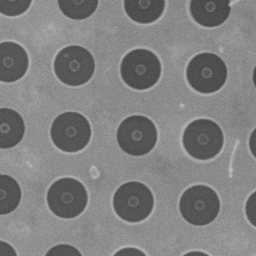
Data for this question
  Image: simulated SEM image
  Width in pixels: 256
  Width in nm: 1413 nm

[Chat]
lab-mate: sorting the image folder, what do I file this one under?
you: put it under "an array of small figures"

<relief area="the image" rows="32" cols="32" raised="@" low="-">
----@@@-----@@@---@--@@---@--@@@
---@@@@@----@@@@-----@@@-----@@@
@@@@@@@@@@@@@@@@----@@@@----@@@@
@@@@@@@@@@@@@@@@@@@@@@@@@@-@@@@@
@@@@@@@@@@@@@@@@@@@@@@@@@@@@@@@@
---@@@@@@@@@@@@@@@@@@@@@@@@@@@@@
---@@@@----@@@@@---@@@@@@@@@@@@@
----@@@-----@@@-----@@@@----@@@@
----@@@--@--@@@--@--@@@-----@@@@
---@@@@-----@@@-----@@@-----@@@@
@@@@@@@@---@@@@@----@@@-----@@@@
@@@@@@@@@@@@@@@@@@@@@@@@---@@@@@
@@@@@@@@@@@@@@@@@@@@@@@@@@@@@@@@
-@@@@@@@@@@@@@@@@@@@@@@@@@@@@@@@
---@@@@----@@@@@--@@@@@@@@@@@@@@
---@@@-----@@@@----@@@@----@@@@@
---@@@--@--@@@@-----@@@-----@@@-
---@@@-----@@@@-----@@@--@--@@@-
-@@@@@@----@@@@----@@@@-----@@@-
@@@@@@@@@@@@@@@@@@@@@@@@---@@@@@
@@@@@@@@@@@@@@@@@@@@@@@@@@@@@@@@
@@@@@@@@@@@@@@@@@@@@@@@@@@@@@@@@
--@@@@@---@@@@@@@@@@@@@@@@@@@@@@
---@@@-----@@@@----@@@@----@@@@@
---@@@--@--@@@-----@@@@----@@@@-
--@@@@-----@@@--@--@@@--@---@@@-
-@@@@@----@@@@-----@@@-----@@@@-
@@@@@@@@@@@@@@@---@@@@@----@@@@-
@@@@@@@@@@@@@@@@@@@@@@@@@@@@@@@@
@@@@@@@@@@@@@@@@@@@@@@@@@@@@@@@@
-@@@@@@@-@@@@@@@@@@@@@@@@@@@@@@@
--@@@@----@@@@----@@@@@---@@@@@@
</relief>